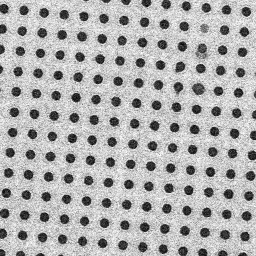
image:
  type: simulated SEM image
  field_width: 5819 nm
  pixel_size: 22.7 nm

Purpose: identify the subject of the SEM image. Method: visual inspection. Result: a regular array of holes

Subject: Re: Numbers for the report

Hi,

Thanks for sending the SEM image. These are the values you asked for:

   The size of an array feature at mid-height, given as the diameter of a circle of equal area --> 0.228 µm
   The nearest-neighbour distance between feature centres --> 454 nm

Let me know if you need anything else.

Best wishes